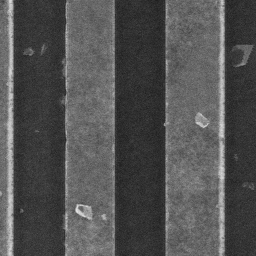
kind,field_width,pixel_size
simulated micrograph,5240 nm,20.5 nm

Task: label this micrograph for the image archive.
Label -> lines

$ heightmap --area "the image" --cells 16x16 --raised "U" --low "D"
UDDDUUUDDDUUUUDD
UDDDUUUDDDUUUUDD
UDDDUUUDDDUUUUDD
UDDDUUUDDDUUUUDD
UDDDUUUDDDUUUUDD
UDDDUUUDDDUUUUDD
UDDDUUUDDDUUUUDD
UDDDUUUDDDUUUUDD
UDDDUUUDDDUUUUDD
UDDDUUUDDDUUUUDD
UDDDUUUDDDUUUUDD
UDDDUUUDDDUUUUDD
UDDDUUUDDDUUUUDD
UDDDUUUDDDUUUUDD
UDDDUUUDDDUUUUDD
UDDDUUUDDDUUUUDD